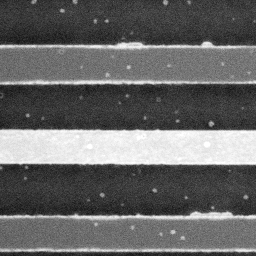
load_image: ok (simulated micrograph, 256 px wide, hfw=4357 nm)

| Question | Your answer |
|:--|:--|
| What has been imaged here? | lines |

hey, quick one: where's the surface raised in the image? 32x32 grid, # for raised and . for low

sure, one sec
................................
................................
................................
................................
................................
................................
################################
################################
################################
################################
................................
................................
................................
................................
................................
................................
###############################.
################################
################################
################################
................................
................................
................................
................................
................................
................................
................................
################################
################################
################################
################################
................................